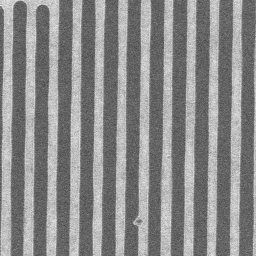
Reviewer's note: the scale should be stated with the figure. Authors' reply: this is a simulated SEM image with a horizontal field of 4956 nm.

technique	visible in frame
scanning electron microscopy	groups of lines, slits or small figures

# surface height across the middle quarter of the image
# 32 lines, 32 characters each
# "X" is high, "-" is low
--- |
XX--XXXX--XXXX--XXX--XXXX--XXXX-
XX--XXXX--XXXX--XXX--XXXX--XXXX-
XX--XXXX--XXXX--XXX--XXXX--XXXX-
XX--XXXX--XXXX--XXX--XXXX--XXXX-
XX--XXXX--XXX---XXX--XXXX--XXXX-
XX--XXXX--XXX---XXX--XXXX--XXXX-
XX--XXXX--XXX---XXX--XXXX--XXX--
XX--XXXX--XXX---XXX--XXXX--XXX--
XX--XXXX--XXX---XXX--XXXX--XXX--
XX--XXXX--XXX---XXX--XXXX--XXX--
XX--XXXX--XXX---XXX--XXXX--XXX--
XX--XXXX--XXX---XXX--XXXX--XXX--
XX--XXXX--XXX---XXX--XXXX--XXX--
XX--XXXX--XXX---XXX--XXXX--XXX--
XX--XXXX--XXX---XXX--XXXX--XXX--
XX--XXXX--XXX---XXX--XXXX--XXX--
XX--XXXX--XXX---XXX--XXXX--XXX--
XX--XXXX--XXX---XXX--XXXX--XXX--
XX--XXXX--XXX---XXX--XXXX--XXX--
XX--XXXX--XXX---XXX--XXXX--XXX--
XX--XXX---XXX---XXX--XXXX--XXX--
XX--XXX---XXX--XXXX--XXXX--XXX--
XX--XXX---XXX--XXXX--XXXX--XXX--
XX--XXX---XXX--XXXX--XXXX-XXXX--
XX--XXX---XXX--XXXX--XXXX--XXX--
XX--XXX---XXX--XXXX--XXX---XXX--
XX--XXX---XXX--XXXX--XXX---XXX--
XX--XXX---XXX--XXXX--XXX---XXX--
XX--XXX---XXX--XXXX--XXX---XXX--
XX--XXX---XXX--XXXX--XXX---XXX--
XX--XXX---XXX--XXXX--XXX---XXX--
XX--XXX--XXXX--XXXX--XXX---XXX--